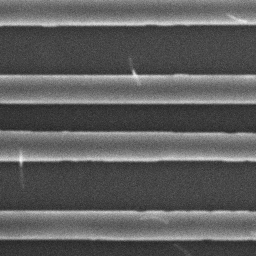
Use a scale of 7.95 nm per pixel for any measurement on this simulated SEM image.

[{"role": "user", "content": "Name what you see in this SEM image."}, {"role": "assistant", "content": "lines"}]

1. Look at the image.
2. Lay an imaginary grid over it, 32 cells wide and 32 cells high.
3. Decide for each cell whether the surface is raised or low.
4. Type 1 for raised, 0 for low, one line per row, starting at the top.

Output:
11111111111111111111111111111111
11111111111111111111111111111111
11111111111111111111111111111111
00000000000000000000000000000000
00000000000000000000000000000000
00000000000000000000000000000000
00000000000000000000000000000000
00000000000000000000000000000000
00000000000000000000000000000000
11111111111111111111111111111111
11111111111111111111111111111111
11111111111111111111111111111111
11111111111111111111111111111111
00000000000000000000000000000000
00000000000000000000000000000000
00000000000000000000000000000000
11110000100000000000000000000000
11111111111111111111111111111111
11111111111111111111111111111111
11111111111111111111111111111111
00000000000000000000000000000000
00000000000000000000000000000000
00000000000000000000000000000000
00000000000000000000000000000000
00000000000000000000000000000000
00000000000000000000000000000000
11111111111111111011111111111110
11111111111111111111111111111111
11111111111111111111111111111111
11111111111111111111111111111111
00000000000000000000000000000000
00000000000000000000000000000000